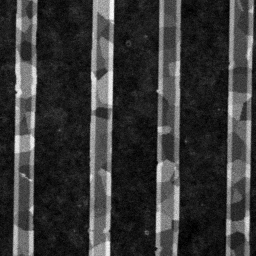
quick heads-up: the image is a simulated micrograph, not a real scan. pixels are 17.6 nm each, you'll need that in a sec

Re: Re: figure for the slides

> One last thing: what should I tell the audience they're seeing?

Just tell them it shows one or a few lines or trenches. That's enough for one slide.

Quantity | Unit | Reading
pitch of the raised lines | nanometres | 1260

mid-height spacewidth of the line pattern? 929 nm